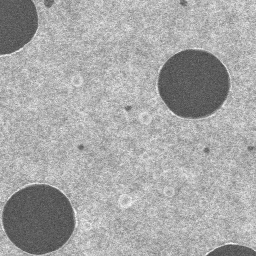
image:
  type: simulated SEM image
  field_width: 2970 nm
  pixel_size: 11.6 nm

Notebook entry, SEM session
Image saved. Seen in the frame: holes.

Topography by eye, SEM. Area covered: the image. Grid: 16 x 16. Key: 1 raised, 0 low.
0011111111111111
0011111111111111
0011111111111111
1111111111100111
1111111111000011
1111111111000011
1111111111000011
1111111111111111
1111111111111111
1111111111111111
1111111111111111
1111111111111111
1000111111111111
0000011111111111
0000011111111111
1000111111111100